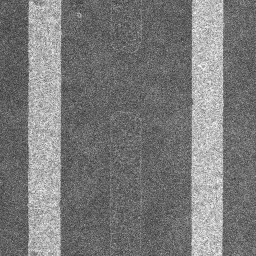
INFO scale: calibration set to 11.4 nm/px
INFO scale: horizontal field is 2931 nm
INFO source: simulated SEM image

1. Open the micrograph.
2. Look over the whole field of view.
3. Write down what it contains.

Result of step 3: one or a few lines or trenches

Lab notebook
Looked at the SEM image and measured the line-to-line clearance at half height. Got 0.586 micrometres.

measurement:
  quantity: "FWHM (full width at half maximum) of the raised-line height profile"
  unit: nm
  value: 345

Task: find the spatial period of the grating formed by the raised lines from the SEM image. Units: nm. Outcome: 932